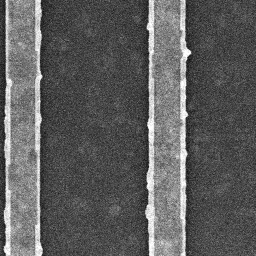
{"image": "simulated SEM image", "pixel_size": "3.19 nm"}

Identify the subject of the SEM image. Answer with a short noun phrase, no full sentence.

one or a few lines or trenches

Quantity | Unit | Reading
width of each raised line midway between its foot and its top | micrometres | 0.113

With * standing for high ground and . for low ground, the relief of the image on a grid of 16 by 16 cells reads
***......***....
***......***....
***......***....
**.......***....
**.......***....
**.......***....
***......***....
***......***....
**.......***....
**.......***....
**.......***....
**.......***....
**.......***....
**.......***....
**.......**.....
***......***....